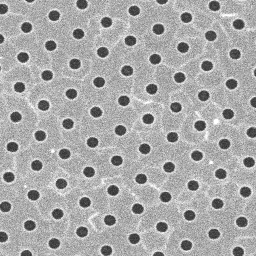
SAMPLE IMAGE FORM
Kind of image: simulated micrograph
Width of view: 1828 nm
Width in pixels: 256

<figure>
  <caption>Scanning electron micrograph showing a regular array of holes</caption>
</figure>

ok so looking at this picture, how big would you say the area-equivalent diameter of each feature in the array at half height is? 82.6 nanometers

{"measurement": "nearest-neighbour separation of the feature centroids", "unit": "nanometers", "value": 214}